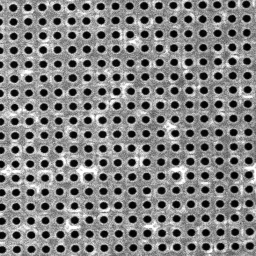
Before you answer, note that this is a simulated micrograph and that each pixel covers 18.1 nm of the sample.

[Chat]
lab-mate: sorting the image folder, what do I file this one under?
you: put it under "a regular array of holes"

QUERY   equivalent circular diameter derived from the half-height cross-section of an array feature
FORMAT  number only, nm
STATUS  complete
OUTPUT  144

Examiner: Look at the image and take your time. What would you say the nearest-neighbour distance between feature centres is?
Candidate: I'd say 252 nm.